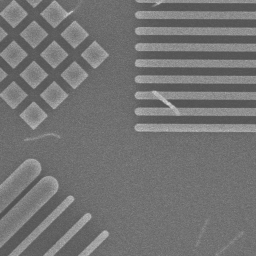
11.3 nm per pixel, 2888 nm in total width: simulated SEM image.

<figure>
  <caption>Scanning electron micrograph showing groups of lines, slits or small figures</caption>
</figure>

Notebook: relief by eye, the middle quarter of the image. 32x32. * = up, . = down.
.***...**.........**************
*****...........................
******..........................
******............**************
.***..............**************
..*.............................
................................
*.................**************
..................**************
.........................*......
..........................**....
..................**************
..................**************
................................
................................
..................**************
..................**************
................................
................................
................................
................................
................................
................................
................................
................................
................................
................................
................................
................................
................................
................................
................................